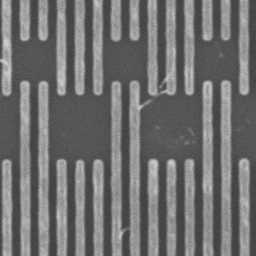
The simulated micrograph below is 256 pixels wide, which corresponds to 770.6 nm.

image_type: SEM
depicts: wiring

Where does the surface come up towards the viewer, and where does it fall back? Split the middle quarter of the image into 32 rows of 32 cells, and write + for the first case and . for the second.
...++...+............++...++..++
...++..++............++...++..++
...++..+++...........++...++..++
...++..+++...........++...++..++
...++...++.......+...++...++..++
...++...++..++...++..++...++..++
...++...+...++...++..++..+++..++
........+...++...++...+...+....+
............++...++.............
............++...++.............
............++...++.............
............++...++.............
............++...++.............
............++...++.............
............++...++.............
............++...++.............
............++...+..............
............++...++.............
............++...++.............
............++...++.............
............++...++.............
............++...++.............
............++...++.............
............++...++.............
...++...++..++...++..++...++..++
...++..+++..++...++..++...++..++
...++..+++..++...++..++...++..++
...++..+++..++...++..++...++..++
...++..+++..++...++..++...++..++
+..++..+++..++...++..++...++..++
+..++...++..++...++..++...++..++
+..++...++..++...++..++...++..++